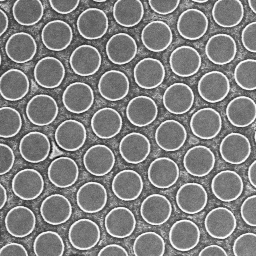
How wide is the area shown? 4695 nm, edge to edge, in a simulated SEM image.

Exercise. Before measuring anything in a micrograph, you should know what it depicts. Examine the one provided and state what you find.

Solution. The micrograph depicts a regular array of raised bodies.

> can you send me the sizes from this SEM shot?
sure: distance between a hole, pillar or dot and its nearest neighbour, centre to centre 689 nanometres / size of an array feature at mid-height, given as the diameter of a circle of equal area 547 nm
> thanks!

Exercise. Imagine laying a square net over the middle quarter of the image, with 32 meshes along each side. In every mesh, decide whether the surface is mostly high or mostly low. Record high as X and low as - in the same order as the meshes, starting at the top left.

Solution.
--XXXXXXX---------XXXXXXX--XXXXX
--XXXXXX----------XXXXXXX--XXXXX
----XXX---XXXXX---XXXXXXX---XXXX
---------XXXXXXX--XXXXXXX-------
---------XXXXXXX--XXXXXX--------
-XXXXX---XXXXXXX---XXXX----XXXX-
-XXXXXX--XXXXXXX----------XXXXXX
XXXXXXX--XXXXXXX---------XXXXXXX
XXXXXXX----XXX----XXX----XXXXXXX
XXXXXXX----------XXXXX---XXXXXXX
XXXXXXX---------XXXXXXX--XXXXXXX
-XXXXX---XXX----XXXXXXX---XXXXX-
--------XXXXXX--XXXXXXX---------
-------XXXXXXX--XXXXXXX---------
XXX----XXXXXXX---XXXXX---XXX----
XXXXX--XXXXXXX----------XXXXXX--
XXXXX--XXXXXXX---------XXXXXXX--
XXXXX---XXXXX----XX----XXXXXXX--
XXXXX----------XXXXX---XXXXXXX--
XXXXX---------XXXXXXX--XXXXXXX--
XXXX----XX----XXXXXXX---XXXXX---
-X----XXXXX---XXXXXXX-----X----X
-----XXXXXXX--XXXXXXX----------X
X----XXXXXXX---XXXXX----------XX
XXX--XXXXXXX-----XX---XXXXX---XX
XXX--XXXXXXX----------XXXXXX--XX
XXX---XXXXX----------XXXXXXXX--X
XXX----XXX---XXXXX---XXXXXXXX---
XXX----------XXXXXX--XXXXXXX----
XX----------XXXXXXX---XXXXXX----
X----XXXX---XXXXXXX----XXX----XX
----XXXXXX--XXXXXXX----------XXX